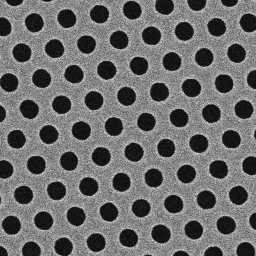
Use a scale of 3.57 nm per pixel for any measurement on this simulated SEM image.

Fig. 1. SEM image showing a regular array of holes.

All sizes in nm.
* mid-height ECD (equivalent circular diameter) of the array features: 66.6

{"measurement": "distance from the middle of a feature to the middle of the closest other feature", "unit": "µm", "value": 0.116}